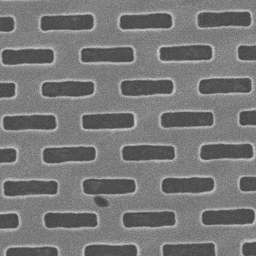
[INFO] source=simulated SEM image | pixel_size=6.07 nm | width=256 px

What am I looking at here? a regular array of holes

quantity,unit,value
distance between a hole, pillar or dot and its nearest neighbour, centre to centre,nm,309